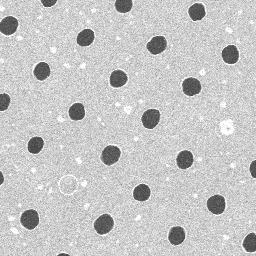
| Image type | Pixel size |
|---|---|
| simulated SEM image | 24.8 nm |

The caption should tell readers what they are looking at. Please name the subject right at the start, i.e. a regular array of holes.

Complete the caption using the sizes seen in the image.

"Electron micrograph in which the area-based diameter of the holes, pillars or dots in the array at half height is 456 nm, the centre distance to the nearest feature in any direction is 51.5 px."